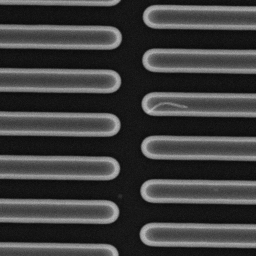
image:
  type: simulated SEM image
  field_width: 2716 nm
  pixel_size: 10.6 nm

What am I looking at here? groups of lines, slits or small figures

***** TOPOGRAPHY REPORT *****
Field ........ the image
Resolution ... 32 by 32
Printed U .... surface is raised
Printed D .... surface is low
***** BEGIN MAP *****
DDDDDDDDDDDDDDDDDDDDDDDDDDDDDDDD
DDDDDDDDDDDDDDDDDDUUUUUUUUUUUUUU
DDDDDDDDDDDDDDDDDDUUUUUUUUUUUUUU
UUUUUUUUUUUUUDDDDDDDDDDDDDDDDDDD
UUUUUUUUUUUUUUUDDDDDDDDDDDDDDDDD
UUUUUUUUUUUUUUUDDDDDDDDDDDDDDDDD
DDDDDDDDDDDDDDDDDDDUUUUUUUUUUUUU
DDDDDDDDDDDDDDDDDDUUUUUUUUUUUUUU
DDDDDDDDDDDDDDDDDDDUUUUUUUUUUUUU
UUUUUUUUUUUUUUUDDDDDDDDDDDDDDDDD
UUUUUUUUUUUUUUUDDDDDDDDDDDDDDDDD
DDDDDDDDDDDDDDDDDDDDDDDDDDDDDDDD
DDDDDDDDDDDDDDDDDDUUUUUUUUUUUUUU
DDDDDDDDDDDDDDDDDDUUUUUUUUUUUUUU
UUUUUUUUUUUUUUDDDDDDDDDDDDDDDDDD
UUUUUUUUUUUUUUUDDDDDDDDDDDDDDDDD
UUUUUUUUUUUUUUDDDDDDDDDDDDDDDDDD
DDDDDDDDDDDDDDDDDDUUUUUUUUUUUUUU
DDDDDDDDDDDDDDDDDDUUUUUUUUUUUUUU
DDDDDDDDDDDDDDDDDDDUUUUUUUUUUUUU
UUUUUUUUUUUUUUUDDDDDDDDDDDDDDDDD
UUUUUUUUUUUUUUUDDDDDDDDDDDDDDDDD
DDDDDDDDDDDDDDDDDDDDDDDDDDDDDDDD
DDDDDDDDDDDDDDDDDDUUUUUUUUUUUUUU
DDDDDDDDDDDDDDDDDDUUUUUUUUUUUUUU
UUUUUUUUUUUUUUDDDDDDDDDDDDDDDDDD
UUUUUUUUUUUUUUUDDDDDDDDDDDDDDDDD
UUUUUUUUUUUUUUDDDDDDDDDDDDDDDDDD
DDDDDDDDDDDDDDDDDDUUUUUUUUUUUUUU
DDDDDDDDDDDDDDDDDDUUUUUUUUUUUUUU
DDDDDDDDDDDDDDDDDDDUUUUUUUUUUUUU
UUUUUUUUUUUUUUDDDDDDDDDDDDDDDDDD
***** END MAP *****